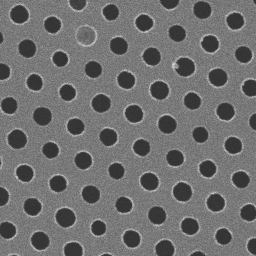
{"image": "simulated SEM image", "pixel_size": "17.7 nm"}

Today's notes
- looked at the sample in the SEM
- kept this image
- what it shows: a regular array of holes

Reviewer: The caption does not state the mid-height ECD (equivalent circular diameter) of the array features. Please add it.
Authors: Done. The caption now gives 17.9 pixels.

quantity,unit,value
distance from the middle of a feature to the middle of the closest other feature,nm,607